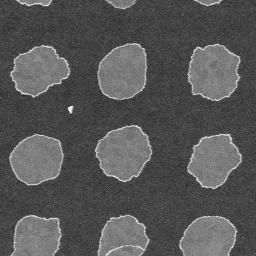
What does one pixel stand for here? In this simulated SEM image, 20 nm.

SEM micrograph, raised bodies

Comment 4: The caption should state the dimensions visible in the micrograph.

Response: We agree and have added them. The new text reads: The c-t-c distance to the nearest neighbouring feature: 1720 nanometers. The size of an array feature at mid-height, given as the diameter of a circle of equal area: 1030 nanometers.